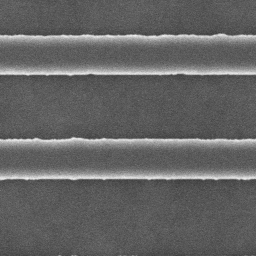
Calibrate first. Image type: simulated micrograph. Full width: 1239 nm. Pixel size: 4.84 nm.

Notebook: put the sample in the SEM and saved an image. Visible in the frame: lines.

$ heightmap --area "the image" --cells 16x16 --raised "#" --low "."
................
................
################
################
################
................
................
................
................
################
################
................
................
................
................
................